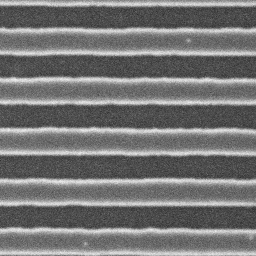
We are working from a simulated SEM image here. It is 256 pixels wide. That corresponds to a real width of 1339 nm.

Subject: lines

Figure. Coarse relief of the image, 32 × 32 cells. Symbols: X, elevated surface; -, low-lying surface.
XXXXXXXXXXXXXXXXXXXXXXXXXXXXXXXX
--------------------------------
--------------------------------
--------------------------------
XXXXXXXXXXXXXXXXXXXXXXXXXXXXXXXX
XXXXXXXXXXXXXXXXXXXXXXXXXXXXXXXX
XXXXXXXXXXXXXXXXXXXXXXXXXXXXXXXX
--------------------------------
--------------------------------
--------------------------------
XXXXXXXXXXXXXXXXXXXXXXXXXXXXXXXX
XXXXXXXXXXXXXXXXXXXXXXXXXXXXXXXX
XXXXXXXXXXXXXXXXXXXXXXXXXXXXXXXX
--------------------------------
--------------------------------
--------------------------------
XXXXXXXXXXXXXXXXXXXXXXXXXXXXXXXX
XXXXXXXXXXXXXXXXXXXXXXXXXXXXXXXX
XXXXXXXXXXXXXXXXXXXXXXXXXXXXXXXX
--------------------------------
--------------------------------
--------------------------------
---XXX------------XXXXXX--------
XXXXXXXXXXXXXXXXXXXXXXXXXXXXXXXX
XXXXXXXXXXXXXXXXXXXXXXXXXXXXXXXX
XXXXXXXXXXXXXXXXXXXXXXXXXXXXXXXX
--------------------------------
--------------------------------
--------------------------------
XXXXXXXXXXXXXXXXXXXXXXXXXXXXXXXX
XXXXXXXXXXXXXXXXXXXXXXXXXXXXXXXX
XXXXXXXXXXXXXXXXXXXXXXXXXXXXXXXX